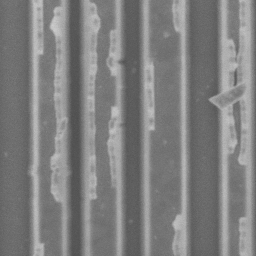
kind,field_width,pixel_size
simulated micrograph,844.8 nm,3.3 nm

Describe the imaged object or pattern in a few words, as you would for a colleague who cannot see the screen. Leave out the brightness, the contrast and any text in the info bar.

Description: one or a few lines or trenches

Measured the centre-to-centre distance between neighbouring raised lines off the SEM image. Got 205 nm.